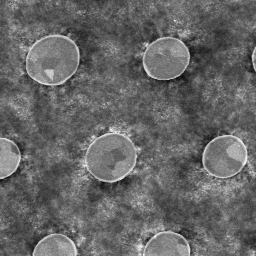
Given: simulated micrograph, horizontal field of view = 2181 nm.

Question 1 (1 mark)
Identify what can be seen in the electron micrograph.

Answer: raised bodies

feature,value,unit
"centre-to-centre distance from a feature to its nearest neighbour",967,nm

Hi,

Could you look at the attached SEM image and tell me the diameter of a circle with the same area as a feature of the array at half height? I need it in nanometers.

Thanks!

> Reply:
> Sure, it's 400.